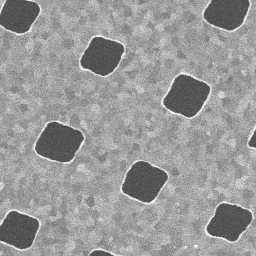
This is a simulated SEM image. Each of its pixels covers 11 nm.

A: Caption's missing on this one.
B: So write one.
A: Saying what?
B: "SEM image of holes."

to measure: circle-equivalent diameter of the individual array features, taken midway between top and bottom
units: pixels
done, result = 41.2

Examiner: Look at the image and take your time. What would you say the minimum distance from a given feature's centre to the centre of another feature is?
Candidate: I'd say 1030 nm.